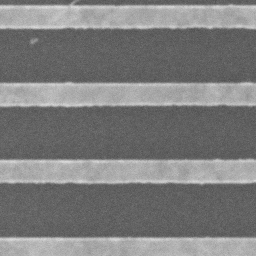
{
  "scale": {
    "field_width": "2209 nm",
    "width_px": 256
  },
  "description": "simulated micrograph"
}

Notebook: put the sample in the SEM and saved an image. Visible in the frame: lines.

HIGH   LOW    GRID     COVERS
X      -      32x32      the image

--------------------------------
XXXXXXXXXXXXXXXXXXXXXXXXXXXXXXXX
XXXXXXXXXXXXXXXXXXXXXXXXXXXXXXXX
XXXXXXXX-XXXXXXXXXX--XXX--X-X-XX
--------------------------------
--------------------------------
--------------------------------
--------------------------------
--------------------------------
--------------------------------
--------X---------------------XX
XXXXXXXXXXXXXXXXXXXXXXXXXXXXXXXX
XXXXXXXXXXXXXXXXXXXXXXXXXXXXXXXX
--------------------------------
--------------------------------
--------------------------------
--------------------------------
--------------------------------
--------------------------------
--------------------------------
XXXXXXXXXXXXXXXXXXXXXXXXXXXXXXXX
XXXXXXXXXXXXXXXXXXXXXXXXXXXXXXXX
XXXXXXXXXXXXXXXXXXXXXXXXXXXXXXXX
--------------------------------
--------------------------------
--------------------------------
--------------------------------
--------------------------------
--------------------------------
--------------------------------
XXXXXXXXXXXXXXXXXXXXXXXXXXXXXXXX
XXXXXXXXXXXXXXXXXXXXXXXXXXXXXXXX